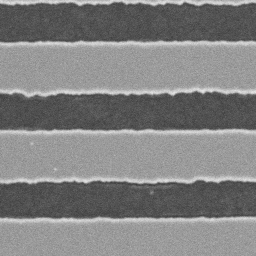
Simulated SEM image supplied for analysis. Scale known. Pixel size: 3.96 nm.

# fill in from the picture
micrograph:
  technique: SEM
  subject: lines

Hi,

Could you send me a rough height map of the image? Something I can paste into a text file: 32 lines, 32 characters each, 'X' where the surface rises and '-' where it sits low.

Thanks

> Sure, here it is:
-XXX------XX------XX----X-XXXX--
--------------------------------
--------------------------------
--------------------------------
--------------------------------
XXXXXXXXXXXXXXXXXXXXXXXXXXXXXXXX
XXXXXXXXXXXXXXXXXXXXXXXXXXXXXXXX
XXXXXXXXXXXXXXXXXXXXXXXXXXXXXXXX
XXXXXXXXXXXXXXXXXXXXXXXXXXXXXXXX
XXXXXXXXXXXXXXXXXXXXXXXXXXXXXXXX
XXXXXXXXXXXXXXXXXXXXXXXXXXXXXXXX
XXXXXXXXXXXXXXXXXXXXXXXX-XXXXXXX
--------------------------------
--------------------------------
--------------------------------
--------------------------------
XXXXXXXXXXXXXXXXXXXXXXXXXXXXXXXX
XXXXXXXXXXXXXXXXXXXXXXXXXXXXXXXX
XXXXXXXXXXXXXXXXXXXXXXXXXXXXXXXX
XXXXXXXXXXXXXXXXXXXXXXXXXXXXXXXX
XXXXXXXXXXXXXXXXXXXXXXXXXXXXXXXX
XXXXXXXXXXXXXXXXXXXXXXXXXXXXXXXX
XXXXXXXXXXXXXXXXXXXXXXXXXXXXXXXX
--------------------------------
--------------------------------
--------------------------------
--------------------------------
XXXXXXXXXXXXXXXXXXXXXXXXXXXXXXXX
XXXXXXXXXXXXXXXXXXXXXXXXXXXXXXXX
XXXXXXXXXXXXXXXXXXXXXXXXXXXXXXXX
XXXXXXXXXXXXXXXXXXXXXXXXXXXXXXXX
XXXXXXXXXXXXXXXXXXXXXXXXXXXXXXXX